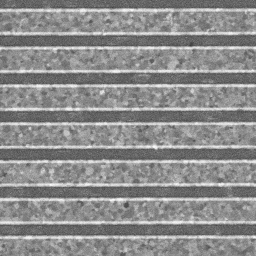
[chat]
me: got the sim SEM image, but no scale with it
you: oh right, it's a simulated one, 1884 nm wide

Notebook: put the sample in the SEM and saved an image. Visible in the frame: parallel lines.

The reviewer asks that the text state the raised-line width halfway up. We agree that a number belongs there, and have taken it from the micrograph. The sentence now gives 168 nm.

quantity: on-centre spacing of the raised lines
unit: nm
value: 278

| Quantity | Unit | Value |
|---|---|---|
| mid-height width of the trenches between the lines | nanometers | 116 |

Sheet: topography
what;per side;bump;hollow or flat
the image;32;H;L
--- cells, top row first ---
LLLLLLLLLLLLLLLLLLLLLLLLLLLLLLLL
HHHHHHHHHHHHHHHHHHHHHHHHHHHHHHHH
HHHHHHHHHHHHHHHHHHHHHHHHHHHHHHHH
HHHHHHHHHHHHHHHHHHHHHHHHHHHHHHHH
LLLLLLLLLLLLLLLLLLLLLLLLLLLLLLLL
LLLLLLLLLLLLLLLLLLLLLLLLLLLLLLLL
HHHHHHHHHHHHHHHHHHHHHHHHHHHHHHHH
HHHHHHHHHHHHHHHHHHHHHHHHHHHHHHHH
HHHHHHHHHHHHHHHHHHHHHHHHHHHHHHHH
LLLLLLLLLLLLLLLLLLLLLLLLLLLLLLLL
LLLLLLLLLLLLLLLLLLLLLLLLLLLLLLLL
HHHHHHHHHHHHHHHHHHHHHHHHHHHHHHHH
HHHHHHHHHHHHHHHHHHHHHHHHHHHHHHHH
HHHHHHHHHHHHHHHHHHHHHLLLLLLLLLLL
LLLLLLLLLLLLLLLLLLLLLLLLLLLLLLLL
LLLLLLLLLLLLLLLLLLLLLLLLLLLLLLLL
HHHHHHHHHHHHHHHHHHHHHHHHHHHHHHHH
HHHHHHHHHHHHHHHHHHHHHHHHHHHHHHHH
LLLLLLLLLLLLLLLLLLLLLLLLLLLLLLLL
LLLLLLLLLLLLLLLLLLLLLLLLLLLLLLLL
HHHHHHHHHHHHHHHHHHHHHHHHHHHHHHHH
HHHHHHHHHHHHHHHHHHHHHHHHHHHHHHHH
HHHHHHHHHHHHHHHHHHHHHHHHHHHHHHHH
LLLLLLLLLLLLLLLLLLLLLLLLLLLLLLLL
LLLLLLLLLLLLLLLLLLLLLLLLLLLLLLLL
HHHHHHHHHHHHHHHHHHHHHHHHHHHHHHHH
HHHHHHHHHHHHHHHHHHHHHHHHHHHHHHHH
HHHHHHHHHHHHHHHHHHHHHHHHHHHHHHHH
LLLLLLLLLLLLLLLLLLLLLLLLLLLLLLLL
LLLLLLLLLLLLLLLLLLLLLLLLLLLLLLLL
HHHHHHHHHHHHHHHHHHHHHHHHHHHHHHHH
HHHHHHHHHHHHHHHHHHHHHHHHHHHHHHHH